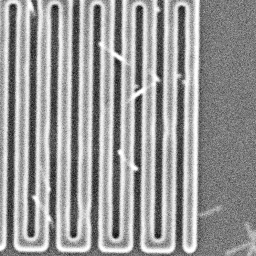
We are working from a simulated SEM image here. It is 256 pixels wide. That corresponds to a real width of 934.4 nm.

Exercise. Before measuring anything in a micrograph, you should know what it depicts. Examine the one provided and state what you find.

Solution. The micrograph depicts groups of lines, slits or small figures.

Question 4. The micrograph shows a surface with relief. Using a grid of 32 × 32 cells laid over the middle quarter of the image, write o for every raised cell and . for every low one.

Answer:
oo..ooo..ooo...ooo..ooo..ooo...o
oo..ooo..ooo...ooo..ooo..ooo...o
oo..ooo..ooo...ooo..ooo..ooo...o
oo..ooo..ooo...ooo..ooo..ooo...o
oo..ooo..ooo...ooo..ooo..ooo...o
oo..ooo..ooo..oooo..ooo..ooo...o
oo..ooo..ooo..oooo.oooo..ooo..oo
oo..ooo..ooo..ooooo.ooo..ooo..oo
oo..ooo..ooo..oooo..ooo..ooo..oo
o...ooo..ooo..ooo...ooo..ooo..oo
o...ooo..ooo..ooo...ooo..ooo..oo
o...ooo..ooo..ooo...ooo..ooo..oo
o...ooo..ooo..ooo...ooo..ooo..oo
o...ooo..ooo..ooo...ooo..ooo..oo
o...ooo..ooo..ooo...ooo..ooo..oo
o...ooo..ooo..ooo...oo...ooo..oo
o...ooo..ooo..ooo...oo...ooo..oo
o...ooo..ooo..ooo...oo...ooo..oo
o...ooo..ooo..ooo...ooo..ooo..oo
o...ooo..ooo..ooo...ooo..ooo..oo
o...ooo..ooo..ooo...ooo..ooo..oo
o...oo...ooo..ooo...ooo..ooo..oo
o...ooo..ooo..ooo...ooo..ooo..oo
o...ooo..ooo..ooo...ooo..ooo..oo
o...ooo..ooo..ooo...ooo..ooo..oo
o...ooo..ooo..oooo..ooo..ooo..oo
o...ooo..ooo..oooo..oo...ooo..oo
o...ooo..ooo..ooo...oo...ooo..oo
o...ooo..ooo..ooo...oo...ooo..oo
o...ooo..ooo..ooo...oo...ooo..oo
o...oo...ooo..ooo...oo...ooo..oo
o...oo...ooo..ooo...oo...ooo..oo